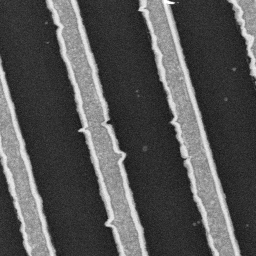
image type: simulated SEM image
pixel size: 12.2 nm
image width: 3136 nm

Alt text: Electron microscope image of one or a few lines or trenches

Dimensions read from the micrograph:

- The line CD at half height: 253 nanometers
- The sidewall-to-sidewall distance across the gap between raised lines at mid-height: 837 nm